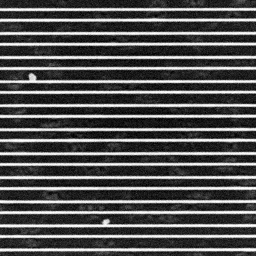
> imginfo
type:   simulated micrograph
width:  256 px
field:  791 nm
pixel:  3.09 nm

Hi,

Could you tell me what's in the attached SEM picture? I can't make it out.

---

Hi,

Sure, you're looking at parallel lines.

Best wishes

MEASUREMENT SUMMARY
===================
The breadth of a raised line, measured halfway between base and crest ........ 6.6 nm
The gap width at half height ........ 0.0282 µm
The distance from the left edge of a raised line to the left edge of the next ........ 0.0372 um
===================